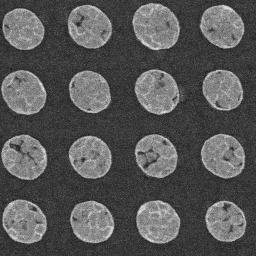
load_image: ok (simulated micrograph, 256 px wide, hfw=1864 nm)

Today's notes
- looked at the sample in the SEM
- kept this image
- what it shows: a regular array of raised bodies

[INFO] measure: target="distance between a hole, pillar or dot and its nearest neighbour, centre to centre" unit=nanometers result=469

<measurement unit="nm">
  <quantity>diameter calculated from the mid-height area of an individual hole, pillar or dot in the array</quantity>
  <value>297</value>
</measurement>